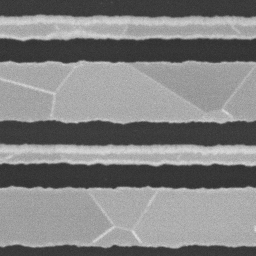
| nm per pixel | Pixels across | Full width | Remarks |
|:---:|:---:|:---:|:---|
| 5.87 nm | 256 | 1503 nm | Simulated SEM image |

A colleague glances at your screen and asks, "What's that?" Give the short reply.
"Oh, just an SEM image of lines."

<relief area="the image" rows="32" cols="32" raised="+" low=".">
................................
................................
++++++++++++++++++++++++++++++++
++++++++++++++++++++++++++++++++
++++++++++++++++++++++++++++++++
................................
................................
................................
++++++++++++++++++++++++++++++++
++++++++++++++++++++++++++++++++
++++++++++++++++++++++++++++++++
++++++++++++++++++++++++++++++++
++++++++++++++++++++++++++++++++
++++++++++++++++++++++++++++++++
++++++++++++++++++++++++++++++++
................................
................................
................................
+++++++++++..++++++++++++..++++.
++++++++++++++++++++++++++++++++
..................++..++.+..+.++
................................
................................
.++.+...+......++.+.+.........++
++++++++++++++++++++++++++++++++
++++++++++++++++++++++++++++++++
++++++++++++++++++++++++++++++++
++++++++++++++++++++++++++++++++
++++++++++++++++++++++++++++++++
++++++++++++++++++++++++++++++++
++++++++++++++++++++++++++++++++
................................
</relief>